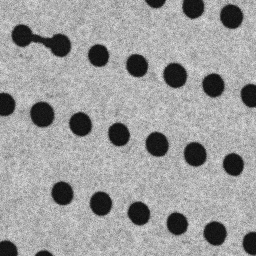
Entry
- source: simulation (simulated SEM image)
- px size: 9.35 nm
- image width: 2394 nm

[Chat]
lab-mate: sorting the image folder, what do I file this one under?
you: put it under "a regular array of holes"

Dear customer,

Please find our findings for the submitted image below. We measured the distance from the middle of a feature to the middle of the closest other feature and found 369 nm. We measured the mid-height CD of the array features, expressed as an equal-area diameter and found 0.215 micrometres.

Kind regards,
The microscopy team